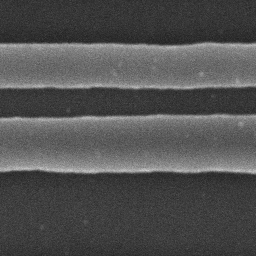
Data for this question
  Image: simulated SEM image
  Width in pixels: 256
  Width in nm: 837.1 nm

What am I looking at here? lines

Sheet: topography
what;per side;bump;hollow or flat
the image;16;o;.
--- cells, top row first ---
................
................
................
oooooooooooooooo
oooooooooooooooo
oooooooooooooooo
oooooooooooooooo
oooooooooooooooo
oooooooooooooooo
oooooooooooooooo
oooooooooooooooo
................
................
................
................
................